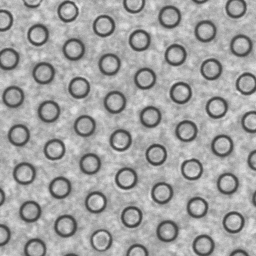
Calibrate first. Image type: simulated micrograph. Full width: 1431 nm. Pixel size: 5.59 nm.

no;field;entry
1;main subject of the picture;a regular array of ring-shaped grooves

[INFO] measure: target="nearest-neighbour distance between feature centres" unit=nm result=213